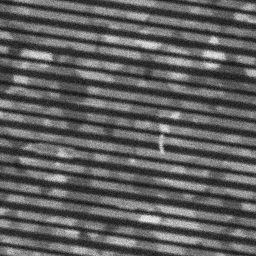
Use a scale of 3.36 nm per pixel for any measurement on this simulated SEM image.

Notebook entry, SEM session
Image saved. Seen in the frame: parallel lines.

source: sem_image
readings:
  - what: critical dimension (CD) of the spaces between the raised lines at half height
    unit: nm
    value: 20.3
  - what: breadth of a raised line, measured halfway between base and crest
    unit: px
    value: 6.04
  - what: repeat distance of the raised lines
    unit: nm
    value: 44.9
